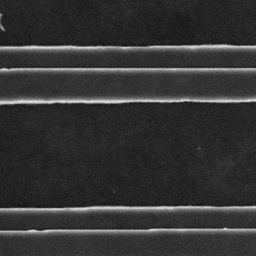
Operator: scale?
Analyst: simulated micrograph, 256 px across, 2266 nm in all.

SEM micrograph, lines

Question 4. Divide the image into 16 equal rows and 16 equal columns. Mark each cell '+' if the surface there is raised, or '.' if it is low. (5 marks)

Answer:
................
................
................
++++++++++++++++
++++++++++++++++
++++++++++++++++
................
................
................
................
................
................
................
++++++++++++++++
++++++++++++++++
++++++++++++++++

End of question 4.